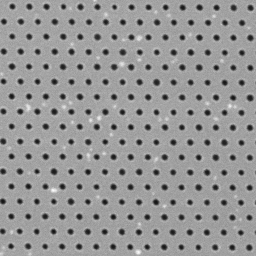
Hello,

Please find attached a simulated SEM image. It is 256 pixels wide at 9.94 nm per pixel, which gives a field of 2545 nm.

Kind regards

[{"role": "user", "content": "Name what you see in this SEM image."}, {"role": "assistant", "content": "a regular array of holes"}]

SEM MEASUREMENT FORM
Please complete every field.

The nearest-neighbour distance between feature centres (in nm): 166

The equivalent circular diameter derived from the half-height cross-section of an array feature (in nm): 63.4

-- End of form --